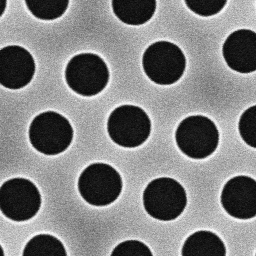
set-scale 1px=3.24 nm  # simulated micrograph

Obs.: holes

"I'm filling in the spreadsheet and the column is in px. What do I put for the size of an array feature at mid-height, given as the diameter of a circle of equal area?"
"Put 44.4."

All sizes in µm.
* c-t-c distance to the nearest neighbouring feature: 0.216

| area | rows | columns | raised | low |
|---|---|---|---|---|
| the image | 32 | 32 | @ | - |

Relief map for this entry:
-@@------@@@@@------@@@-----@@@@
@@@@----@@@@@@-----@@@@@---@@@@@
@@@@@--@@@@@@@@----@@@@@@@@@@@@@
@@@@@@@@@@@@@@@@@@@@@@@@@@@@@@@@
@@@@@@@@@@@@@@@@@@@@@@@@@@@@@---
@@@@@@@@@@@@@@@@@@@---@@@@@@----
----@@@@@@@@@@@@@@-----@@@@@----
----@@@@@----@@@@@-----@@@@@----
----@@@@-----@@@@@-----@@@@@@---
----@@@@------@@@@-----@@@@@@@@@
----@@@@-----@@@@@@@-@@@@@@@@@@@
@@@@@@@@@----@@@@@@@@@@@@@@@@@@@
@@@@@@@@@@@@@@@@@@@@@@@@@@@@@@@@
@@@@@@@@@@@@@@@---@@@@@@@@@@@@@-
@@@@@---@@@@@@-----@@@@@-@@@@@--
@@@@-----@@@@------@@@-----@@@--
@@@@-----@@@@------@@@-----@@@--
@@@@-----@@@@@----@@@@-----@@@--
@@@@----@@@@@@@@@@@@@@-----@@@@@
@@@@@@@@@@@@@@@@@@@@@@@---@@@@@@
@@@@@@@@@@@--@@@@@@@@@@@@@@@@@@@
@@@@@@@@@@-----@@@@@@@@@@@@@@@@@
@---@@@@@@-----@@@@---@@@@@@@---
-----@@@@@-----@@@-----@@@@@----
-----@@@@@-----@@@-----@@@@@----
-----@@@@@@---@@@@-----@@@@@----
-----@@@@@@@@@@@@@-----@@@@@----
@---@@@@@@@@@@@@@@@@--@@@@@@@@@@
@@@@@@@@@@@@@@@@@@@@@@@@@@@@@@@@
@@@@---@@@@@@@@@@@@@@@@@---@@@@@
@@@-----@@@@@@@---@@@@@-----@@@@
@@@-----@@@@@@-----@@@@-----@@@@